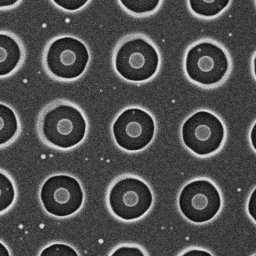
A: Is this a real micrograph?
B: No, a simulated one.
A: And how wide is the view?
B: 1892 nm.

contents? an array of small figures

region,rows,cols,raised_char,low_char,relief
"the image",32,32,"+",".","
..+++++....++++.....++++....++++
++++++++++++++++...+++++....++++
++++++++++++++++++++++++++++++++
++++++++++++++++++++++++++++++++
.+++++++++++++++++++++++++++++++
..++++....+++++....++++++..+++++
...+++.....++++.....+++.....++++
...+++.....+++......+++......+++
..++++.....+++......+++......+++
+++++++...+++++....+++++....++++
+++++++++++++++++++++++++..+++++
++++++++++++++++++++++++++++++++
++++++++++++++++++++++++++++++++
.+++++....++++++++++++++++++++++
..+++.....+++++....+++++...+++++
..+++......+++.....++++.....++++
..+++......+++.....++++.....+++.
.+++++....++++.....++++.....+++.
+++++++..++++++...++++++...+++++
++++++++++++++++++++++++++++++++
++++++++++++++++++++++++++++++++
++++++++++++++++++++++++++++++++
.+++++...++++++...+++++++.++++++
..+++.....++++.....++++....+++++
..+++.....++++.....+++......+++.
.++++.....++++.....+++......+++.
++++++...+++++....+++++....++++.
++++++++++++++++++++++++..++++++
++++++++++++++++++++++++++++++++
++++++++++++++++++++++++++++++++
+++++++.++++++++++++++++++++++++
.++++....+++++....+++++...++++++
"